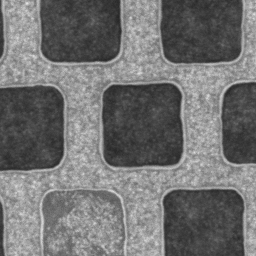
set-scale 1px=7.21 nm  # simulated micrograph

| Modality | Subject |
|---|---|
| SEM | holes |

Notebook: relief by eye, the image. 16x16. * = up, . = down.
**......**.....*
***.....**.....*
***.....**.....*
***....***.....*
****************
...****....***..
....**.....***..
....**.....***..
....**......**..
....**.....***..
...*****.*******
****************
**********.....*
**********.....*
**********.....*
**********.....*